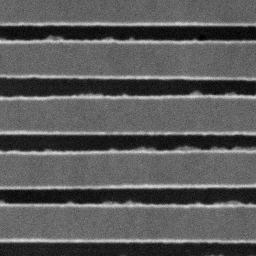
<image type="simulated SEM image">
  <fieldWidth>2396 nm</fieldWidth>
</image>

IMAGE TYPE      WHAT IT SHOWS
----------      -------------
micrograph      lines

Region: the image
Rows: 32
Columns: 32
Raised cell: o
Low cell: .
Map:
oooooooooooooooooooooooooooooooo
oooooooooooooooooooooooooooooooo
oooooooooooooooooooooooooooooooo
................................
................................
oooooooooooooooooooooooooooooooo
oooooooooooooooooooooooooooooooo
oooooooooooooooooooooooooooooooo
oooooooooooooooooooooooooooooooo
oooooooooooooooooooooooooooooooo
................................
................................
oooooooooooooooooooooooooooooooo
oooooooooooooooooooooooooooooooo
oooooooooooooooooooooooooooooooo
oooooooooooooooooooooooooooooooo
oooooooooooooooooooooooooooooooo
................................
................................
oooooooooooooooooooooooooooooooo
oooooooooooooooooooooooooooooooo
oooooooooooooooooooooooooooooooo
oooooooooooooooooooooooooooooooo
ooooooooo.ooo...................
................................
........o.......................
oooooooooooooooooooooooooooooooo
oooooooooooooooooooooooooooooooo
oooooooooooooooooooooooooooooooo
oooooooooooooooooooooooooooooooo
................................
................................